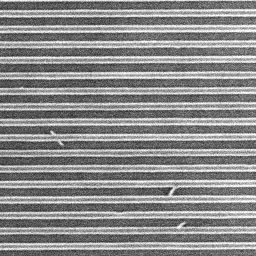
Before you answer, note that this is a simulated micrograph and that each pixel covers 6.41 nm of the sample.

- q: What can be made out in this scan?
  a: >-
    parallel lines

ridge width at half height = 37.6 nm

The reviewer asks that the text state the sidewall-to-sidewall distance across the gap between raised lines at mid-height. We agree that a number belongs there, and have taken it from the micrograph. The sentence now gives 62.5 nm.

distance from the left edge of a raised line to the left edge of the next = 99.5 nm